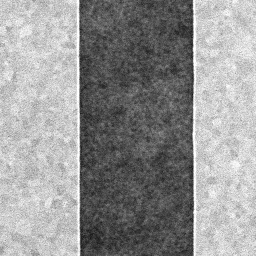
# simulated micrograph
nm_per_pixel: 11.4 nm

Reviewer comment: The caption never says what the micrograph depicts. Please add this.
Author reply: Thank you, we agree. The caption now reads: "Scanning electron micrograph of one or a few lines or trenches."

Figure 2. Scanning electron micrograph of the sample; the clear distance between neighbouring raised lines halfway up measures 1320 nm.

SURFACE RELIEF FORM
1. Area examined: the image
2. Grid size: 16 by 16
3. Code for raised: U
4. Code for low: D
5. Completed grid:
UUUUUDDDDDDDUUUU
UUUUUDDDDDDDUUUU
UUUUUDDDDDDDUUUU
UUUUUDDDDDDDUUUU
UUUUUDDDDDDDUUUU
UUUUUDDDDDDDUUUU
UUUUUDDDDDDDUUUU
UUUUUDDDDDDDUUUU
UUUUUDDDDDDDUUUU
UUUUUDDDDDDDUUUU
UUUUUDDDDDDDUUUU
UUUUUDDDDDDDUUUU
UUUUUDDDDDDDUUUU
UUUUUDDDDDDDUUUU
UUUUUDDDDDDDUUUU
UUUUUDDDDDDDUUUU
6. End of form